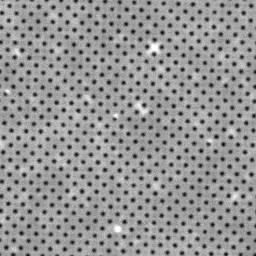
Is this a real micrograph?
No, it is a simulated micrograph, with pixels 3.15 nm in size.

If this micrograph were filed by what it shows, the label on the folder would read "a regular array of holes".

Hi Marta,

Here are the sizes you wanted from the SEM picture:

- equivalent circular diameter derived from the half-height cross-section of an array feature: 0.0133 micrometres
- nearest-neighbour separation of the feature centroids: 31.9 nanometres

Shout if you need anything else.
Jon